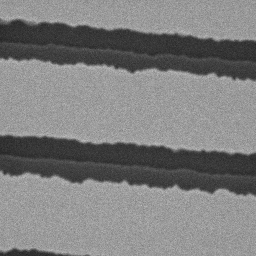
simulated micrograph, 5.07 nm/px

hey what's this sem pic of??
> lines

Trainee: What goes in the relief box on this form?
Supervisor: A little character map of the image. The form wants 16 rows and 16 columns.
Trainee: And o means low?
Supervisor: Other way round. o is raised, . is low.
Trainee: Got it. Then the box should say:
oooooooooooooooo
....oooooooooooo
................
................
ooooooooooo.....
oooooooooooooooo
oooooooooooooooo
oooooooooooooooo
...ooooooooooooo
..............oo
................
oooooooo........
oooooooooooooooo
oooooooooooooooo
oooooooooooooooo
oooooooooooooooo